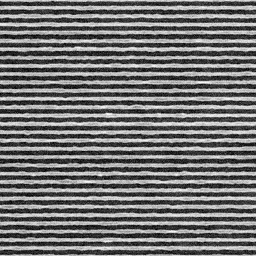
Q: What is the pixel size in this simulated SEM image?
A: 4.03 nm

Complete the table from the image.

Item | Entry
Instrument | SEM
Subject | parallel lines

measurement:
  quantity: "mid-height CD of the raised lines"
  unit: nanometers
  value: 10.6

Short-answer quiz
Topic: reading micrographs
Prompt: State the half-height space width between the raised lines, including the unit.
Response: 21.2 nanometres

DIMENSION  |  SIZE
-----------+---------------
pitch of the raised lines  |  0.0334 um